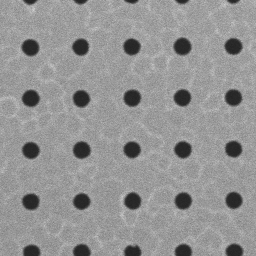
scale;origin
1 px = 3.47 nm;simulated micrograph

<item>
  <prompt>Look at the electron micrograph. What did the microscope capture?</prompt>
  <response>a regular array of holes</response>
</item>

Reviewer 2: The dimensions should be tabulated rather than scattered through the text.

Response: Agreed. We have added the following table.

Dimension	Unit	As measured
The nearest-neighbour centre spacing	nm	176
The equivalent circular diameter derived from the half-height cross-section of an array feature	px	17.2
